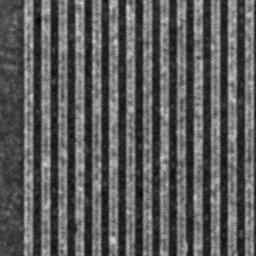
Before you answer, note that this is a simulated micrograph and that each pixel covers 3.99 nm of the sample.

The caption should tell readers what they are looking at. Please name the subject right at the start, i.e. parallel lines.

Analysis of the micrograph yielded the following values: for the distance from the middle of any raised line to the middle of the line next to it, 67.7 nm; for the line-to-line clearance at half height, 41.9 nm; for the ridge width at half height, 27.9 nanometers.